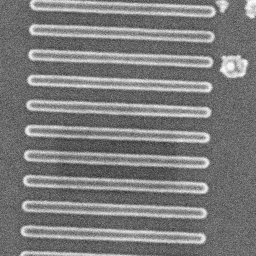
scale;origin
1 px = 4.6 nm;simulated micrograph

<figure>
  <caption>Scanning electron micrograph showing groups of lines, slits or small figures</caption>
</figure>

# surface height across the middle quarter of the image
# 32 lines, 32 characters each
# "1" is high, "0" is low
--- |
00000000000000000000000000000000
00000000000000000000000000000000
00000000000000000000000000000000
11110000000000000000000000000000
11111111111111111111111111111100
01111111111111111111111111111111
00000000000000000000000000000001
00000000000000000000000000000000
00000000000000000000000000000000
00000000000000000000000000000000
11111111111111111111100000000000
11111111111111111111111111111111
00000000000000011111111111111111
00000000000000000000000000000000
00000000000000000000000000000000
00000000000000000000000000000000
11111111111111111100000000000000
11111111111111111111111111111111
00000000000111111111111111111111
00000000000000000000000000000000
00000000000000000000000000000000
00000000000000000000000000000000
11111111000000000000000000000000
11111111111111111111111111111111
11111111111111111111111111111111
00000000000000000000000000000111
00000000000000000000000000000000
00000000000000000000000000000000
11000000000000000000000000000000
11111111111111111111111100000000
11111111111111111111111111111111
00000000000000000011111111111111